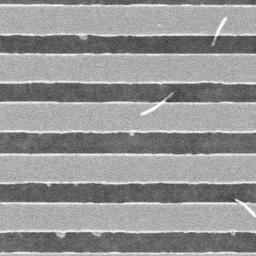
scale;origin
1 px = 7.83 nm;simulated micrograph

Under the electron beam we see lines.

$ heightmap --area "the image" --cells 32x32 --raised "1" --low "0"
00000000000000000000000000000000
11111111111111111111111111111111
11111111111111111111111111111111
11111111111111111111111111111111
00000000000000000000000000110000
00000000000000000000000000000000
00000000000000000000000000000000
11111111111111111111111111111111
11111111111111111111111111111111
11111111111111111111111111111111
00000000000000000000000000000000
00000000000000000000000000000000
00000000000000000000000000000000
11111111111111111111111111111111
11111111111111111111111111111111
11111111111111111111111111111111
00011111101111100110111111111111
00000000000000000000000000000000
00000000000000000000000000000000
11111111111111111111111111111111
11111111111111111111111111111111
11111111111111111111111111111111
11111111111111111111111111111111
00000000000000000000000000000000
00000000000000000000000000000000
11111111111111111111111111111111
11111111111111111111111111111111
11111111111111111111111111111111
11111111111111111111111111111111
00000000000000000000000000000000
00000000000000000000000000000000
00000000000000000000000000000000